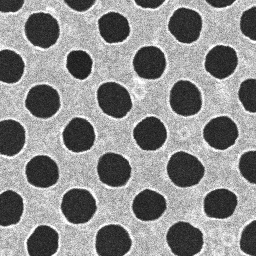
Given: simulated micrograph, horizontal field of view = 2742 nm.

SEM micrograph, a regular array of holes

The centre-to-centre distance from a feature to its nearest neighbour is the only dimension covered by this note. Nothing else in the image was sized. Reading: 531 nm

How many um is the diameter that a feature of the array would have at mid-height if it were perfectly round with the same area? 0.365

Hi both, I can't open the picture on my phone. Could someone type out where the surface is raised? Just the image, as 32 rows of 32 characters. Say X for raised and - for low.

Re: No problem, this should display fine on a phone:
---XXXXX----XXXXX---XXXXXX---XXX
--XXXXXXXXXXXXXXXXXXXX---XXXXX--
XXX----XXXXX----XXXXX----XXXXX--
XXX----XXXXX----XXXXX----XXXXX--
XXX----XXXXXX---XXXXXX---XXXXXX-
XXXX---XXXXXXXXXXXXXXXXXXXXXXXXX
--XXXXXXX--XXXXXX---XXXXXX---XXX
---XXXXX----XXXXX----XXXXX----XX
---XXXXX----XXXXX----XXXXX---XXX
---XXXXXX--XXXXXX---XXXXXXX--XXX
XXXXXXXXXXXXX--XXXXXXX--XXXXXX--
XXXX---XXXXX----XXXXX----XXXXX--
XXX-----XXXX----XXXXX----XXXXX--
XXX----XXXXX----XXXXX----XXXXX--
XXXX--XXXXXXXX--XXXXXXX-XXXXXXXX
--XXXXXX---XXXXXX---XXXXXX---XXX
---XXXXX----XXXXX----XXXX-----XX
---XXXXX----XXXXX----XXXXX----XX
---XXXXX---XXXXXXX--XXXXXXX--XXX
XXXXX-XXXXXXX--XXXXXX---XXXXXX--
XXX----XXXXX----XXXXX----XXXXX--
XXX----XXXXX----XXXXX-----XXXX--
XXX----XXXXXX---XXXXX----XXXXXX-
XXXXX-XXXXXXXXXXXXXXXXXXXXXXXXXX
--XXXXXX----XXXXX---XXXXXX----XX
---XXXXX----XXXXX----XXXX-----XX
---XXXXX----XXXXX----XXXXX---XXX
--XXXXXX---XXXXXXX-XXXXXXXXXXXXX
XXXX---XXXXXX--XXXXXX----XXXXXX-
XXXX---XXXXX----XXXXX----XXXXX--
XXX----XXXXX----XXXXX----XXXXX--
XXXX---XXXXX----XXXXXX---XXXXX--